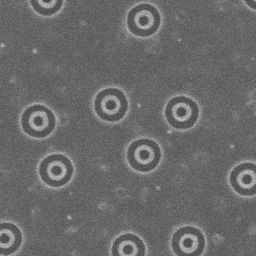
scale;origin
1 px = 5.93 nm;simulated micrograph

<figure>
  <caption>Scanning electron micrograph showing ring-shaped grooves with a dot in the middle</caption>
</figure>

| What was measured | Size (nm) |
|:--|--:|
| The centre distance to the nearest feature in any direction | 338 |